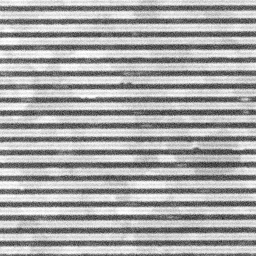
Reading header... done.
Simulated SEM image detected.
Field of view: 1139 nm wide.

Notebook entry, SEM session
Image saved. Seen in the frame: parallel lines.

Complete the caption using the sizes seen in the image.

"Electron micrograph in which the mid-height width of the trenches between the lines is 34.5 nm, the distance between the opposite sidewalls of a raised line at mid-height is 26.7 nm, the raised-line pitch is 58.1 nm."